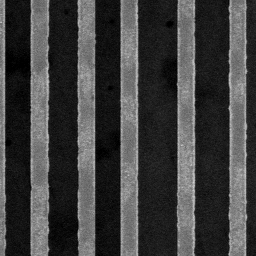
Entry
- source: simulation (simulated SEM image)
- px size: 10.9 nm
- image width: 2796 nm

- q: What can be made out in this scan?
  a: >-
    lines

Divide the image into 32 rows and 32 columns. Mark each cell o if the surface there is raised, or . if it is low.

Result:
o...oo....oo...oo.....oo.....oo.
o...oo....oo...oo.....oo.....oo.
o...oo....oo...oo.....oo.....oo.
o...oo....oo...oo.....oo.....oo.
o...oo....oo...oo.....oo.....oo.
o...oo....oo...oo.....oo.....oo.
o...oo....oo...oo.....oo.....oo.
o...oo....oo...oo.....oo.....oo.
o...oo....oo...oo.....oo.....oo.
o...oo....oo...oo.....oo.....oo.
o...oo....oo...oo.....oo.....oo.
o...oo....oo...oo.....oo.....oo.
o...oo....oo...oo.....oo.....oo.
o...oo....oo...oo.....oo.....oo.
o...oo....oo...oo.....oo.....oo.
o...oo....oo...oo.....oo.....oo.
o...oo....oo...oo.....oo.....oo.
o...oo....oo...oo.....oo.....oo.
o...oo....oo...oo.....oo.....oo.
o...oo....oo...oo.....oo.....oo.
o...oo....oo...oo.....oo.....oo.
o...oo....oo...oo.....oo.....oo.
o...oo....oo...oo.....oo.....oo.
o...oo....oo...oo.....oo.....oo.
o...oo....oo...oo.....oo.....oo.
o...oo....oo...oo.....oo.....oo.
o...oo....oo...oo.....oo.....oo.
o...oo....oo...oo.....oo.....oo.
o...oo....oo...oo.....oo.....oo.
o...oo....oo...oo.....oo.....oo.
o...oo....oo...oo.....oo.....oo.
o...oo....oo...oo.....oo.....oo.